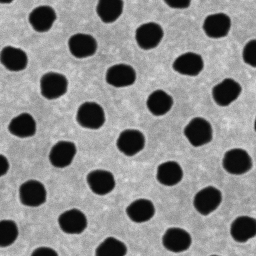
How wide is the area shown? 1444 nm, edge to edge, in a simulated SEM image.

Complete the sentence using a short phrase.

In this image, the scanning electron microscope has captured a regular array of holes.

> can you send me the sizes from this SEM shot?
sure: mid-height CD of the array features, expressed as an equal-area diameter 145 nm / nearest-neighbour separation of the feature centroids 0.27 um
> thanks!